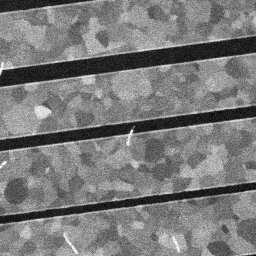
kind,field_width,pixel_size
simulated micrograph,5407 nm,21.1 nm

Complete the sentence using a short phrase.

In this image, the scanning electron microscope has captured one or a few lines or trenches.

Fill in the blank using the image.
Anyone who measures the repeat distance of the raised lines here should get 1480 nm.